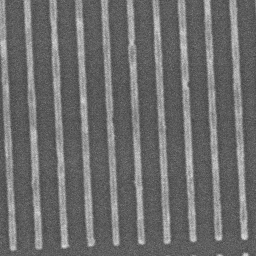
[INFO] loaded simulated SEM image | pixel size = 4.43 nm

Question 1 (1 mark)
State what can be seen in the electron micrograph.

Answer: parallel lines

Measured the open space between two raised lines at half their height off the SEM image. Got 90.1 nm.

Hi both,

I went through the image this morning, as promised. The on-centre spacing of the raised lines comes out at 114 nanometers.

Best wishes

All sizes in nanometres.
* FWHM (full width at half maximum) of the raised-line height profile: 25.4